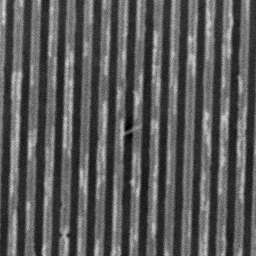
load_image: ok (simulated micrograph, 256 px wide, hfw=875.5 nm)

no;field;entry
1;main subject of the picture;parallel lines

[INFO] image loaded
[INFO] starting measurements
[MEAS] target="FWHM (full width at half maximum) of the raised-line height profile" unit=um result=0.0286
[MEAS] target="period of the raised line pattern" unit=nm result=59.5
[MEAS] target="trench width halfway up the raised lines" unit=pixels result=9.36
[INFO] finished